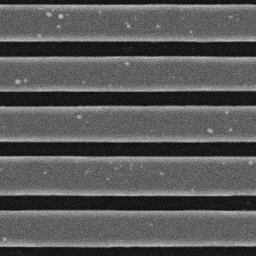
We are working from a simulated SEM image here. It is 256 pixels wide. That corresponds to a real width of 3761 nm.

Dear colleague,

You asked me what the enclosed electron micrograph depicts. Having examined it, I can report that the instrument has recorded lines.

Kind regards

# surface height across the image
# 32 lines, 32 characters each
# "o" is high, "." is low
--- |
................................
oooooooooooooooooooooooooooooooo
oooooooooooooooooooooooooooooooo
oooooooooooooooooooooooooooooooo
oooooooooooooooooooooooooooooooo
................................
................................
oooooooooooooooooooooooooooooooo
oooooooooooooooooooooooooooooooo
oooooooooooooooooooooooooooooooo
oooooooooooooooooooooooooooooooo
................................
................................
oooooooooooooooooooooooooooooooo
oooooooooooooooooooooooooooooooo
oooooooooooooooooooooooooooooooo
oooooooooooooooooooooooooooooooo
oooooooooooooooooooooooooooooooo
................................
................................
oooooooooooooooooooooooooooooooo
oooooooooooooooooooooooooooooooo
oooooooooooooooooooooooooooooooo
oooooooooooooooooooooooooooooooo
................................
................................
oooooooooooooooooooooooooooooooo
oooooooooooooooooooooooooooooooo
oooooooooooooooooooooooooooooooo
oooooooooooooooooooooooooooooooo
oooooooooooooooooooooooooooooooo
................................